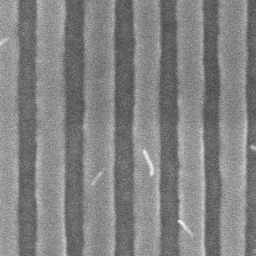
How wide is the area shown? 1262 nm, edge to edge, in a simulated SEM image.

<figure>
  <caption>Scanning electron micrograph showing lines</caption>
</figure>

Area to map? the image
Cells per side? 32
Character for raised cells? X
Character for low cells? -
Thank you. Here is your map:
XX---XXX---XXX---XXX--XXX---XXX-
XX---XXX---XXX---XXX--XXX--XXXX-
XX---XXX---XXX---XXX--XXX--XXXX-
XX---XXX---XXX---XXX--XXX--XXXX-
XX---XXX---XXX---XXX--XXX--XXXX-
XX---XXX---XXX---XXX--XXX--XXXX-
XX---XXX---XXX---XXX--XXX--XXXX-
XX---XXX---XXX---XXX--XXX--XXXX-
XX---XXX---XXX---XXX--XXX---XXX-
XX---XXX---XXX---XXX--XXX---XXX-
XX---XXX---XXX---XXX--XXX---XXX-
XX---XXX---XXX---XXX--XXX---XXX-
XX---XXX---XXX---XXX--XXX---XXX-
XX---XXX---XXX---XXX--XXX---XXX-
XX---XXX---XXX---XXX--XXX---XXX-
XX---XXX--XXXX---XXX--XXX---XXX-
XX---XXX---XXX---XXX--XXX---XXX-
XX---XXX---XXX---XXX--XXX---XXX-
XX---XXX---XXX---XXX--XXX---XXX-
XX---XXX---XXX---XXX--XXX---XXX-
XX---XXX---XXX---XXX---XX---XXX-
XX---XXX---XXX---XXX--XXX---XXX-
XX---XXX---XXX---XXX--XXX---XXX-
XX---XXX---XXX---XXX--XXXX--XXX-
XX---XXX---XXX---XXX--XXX---XXX-
XX---XXX---XXX---XXX---XX---XXX-
XX---XXX---XXX---XXX--XXX---XXX-
XX---XXX---XXX---XXX---XX---XXX-
XX---XXX---XXX---XXX---XX---XX--
XX---XXX---XXX---XXX---XX---XX--
XX---XXX---XXX---XXX---XX---XX--
XX---XXX---XXX---XXX---XXX--XX--